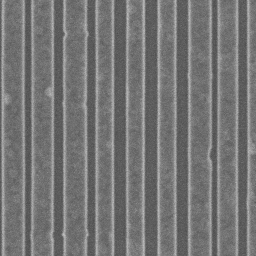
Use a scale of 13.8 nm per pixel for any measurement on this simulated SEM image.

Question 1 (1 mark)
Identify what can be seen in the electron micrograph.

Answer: parallel lines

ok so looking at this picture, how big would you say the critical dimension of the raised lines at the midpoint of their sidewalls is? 0.272 um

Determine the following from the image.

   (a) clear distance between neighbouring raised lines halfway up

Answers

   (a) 146 nanometers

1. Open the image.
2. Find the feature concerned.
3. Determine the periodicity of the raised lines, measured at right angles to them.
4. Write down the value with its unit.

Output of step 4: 421 nm